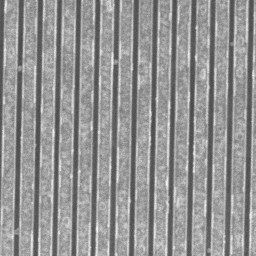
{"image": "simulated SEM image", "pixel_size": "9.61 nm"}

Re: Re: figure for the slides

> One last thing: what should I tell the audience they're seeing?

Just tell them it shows parallel lines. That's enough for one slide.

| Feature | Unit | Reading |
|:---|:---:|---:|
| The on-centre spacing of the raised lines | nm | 184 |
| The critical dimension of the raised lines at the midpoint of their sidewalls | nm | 127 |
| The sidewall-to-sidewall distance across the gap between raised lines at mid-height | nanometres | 60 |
